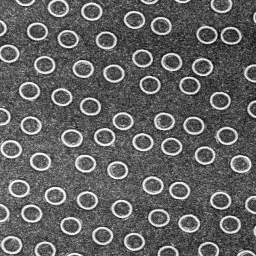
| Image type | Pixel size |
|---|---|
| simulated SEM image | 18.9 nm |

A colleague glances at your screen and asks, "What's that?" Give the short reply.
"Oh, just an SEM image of a regular array of raised bodies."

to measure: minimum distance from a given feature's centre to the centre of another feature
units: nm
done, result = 563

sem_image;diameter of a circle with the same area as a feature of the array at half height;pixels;17.6